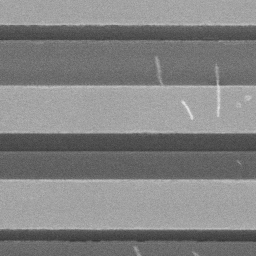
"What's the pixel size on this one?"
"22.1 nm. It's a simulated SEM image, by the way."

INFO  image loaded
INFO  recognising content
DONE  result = lines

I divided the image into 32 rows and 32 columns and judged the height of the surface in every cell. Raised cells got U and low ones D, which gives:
UUUUUUUUUUUUUUUUUUUUUUUUUUUUUUUU
UUUUUUUUUUUUUUUUUUUUUUUUUUUUUUUU
UUUUUUUUUUUUUUUUUUUUUUUUUUUUUUUU
DDDDDDDDDDDDDDDDDDDDDDDDDDDDDDDD
DDDDDDDDDDDDDDDDDDDDDDDDDDDDDDDD
DDDDDDDDDDDDDDDDDDDDDDDDDDDDDDDD
DDDDDDDDDDDDDDDDDDDDDDDDDDDDDDDD
DDDDDDDDDDDDDDDDDDDDDDDDDDDDDDDD
DDDDDDDDDDDDDDDDDDDDDDDDDDDDDDDD
DDDDDDDDDDDDDDDDDDDDDDDDDDDDDDDD
DDDDDDDDDDDDDDDDDDDDDDDDDDDDDDDD
UUUUUUUUUUUUUUUUUUUUUUUUUUUUUUUU
UUUUUUUUUUUUUUUUUUUUUUUUUUUUUUUU
UUUUUUUUUUUUUUUUUUUUUUUUUUUUUUUU
UUUUUUUUUUUUUUUUUUUUUUUUUUUUUUUU
UUUUUUUUUUUUUUUUUUUUUUUUUUUUUUUU
UUUUUUUUUUUUUUUUUUUUUUUUUUUUUUUU
DDDDDDDDDDDDDDDDDDDDDDDDDDDDDDDD
DDDDDDDDDDDDDDDDDDDDDDDDDDDDDDDD
DDDDDDDDDDDDDDDDDDDDDDDDDDDDDDDD
DDDDDDDDDDDDDDDDDDDDDDDDDDDDDDDD
DDDDDDDDDDDDDDDDDDDDDDDDDDDDDDDD
DDDDDDDDDDDDDDDDDDDDDDDDDDDDDDDD
UUUUUUUUUUUUUUUUUUUUUUUUUUUUUUUU
UUUUUUUUUUUUUUUUUUUUUUUUUUUUUUUU
UUUUUUUUUUUUUUUUUUUUUUUUUUUUUUUU
UUUUUUUUUUUUUUUUUUUUUUUUUUUUUUUU
UUUUUUUUUUUUUUUUUUUUUUUUUUUUUUUU
UUUUUUUUUUUUUUUUUUUUUUUUUUUUUUUU
DDDDDDDDDDDDDDDDDDDDDDDDDDDDDDDD
DDDDDDDDDDDDDDDDDDDDDDDDDDDDDDDD
DDDDDDDDDDDDDDDDDDDDDDDDDDDDDDDD